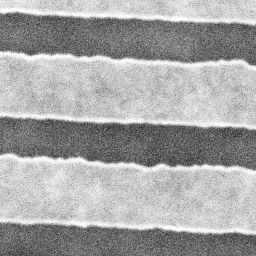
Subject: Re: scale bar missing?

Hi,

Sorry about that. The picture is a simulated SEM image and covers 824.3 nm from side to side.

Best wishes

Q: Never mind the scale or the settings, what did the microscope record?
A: lines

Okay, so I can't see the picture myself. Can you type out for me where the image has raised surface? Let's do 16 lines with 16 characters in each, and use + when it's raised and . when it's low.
++++++++++++++++
................
................
++++............
++++++++++++++++
++++++++++++++++
++++++++++++++++
....++++++++++++
................
................
+++++++++++++++.
++++++++++++++++
++++++++++++++++
++++++++++++++++
............++.+
................